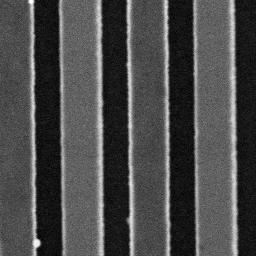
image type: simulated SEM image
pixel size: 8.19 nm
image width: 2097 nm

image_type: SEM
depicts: lines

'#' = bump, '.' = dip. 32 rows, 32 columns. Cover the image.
####....#####...#####...#####...
####....#####...#####...#####...
####....#####...#####...#####...
####....#####...#####...#####...
####....#####...#####...#####...
####....#####...#####...#####...
####....#####...#####...#####...
####....#####...#####...#####...
####....#####...#####...#####...
####....#####...#####...#####...
####....#####...#####...#####...
####....#####...#####...#####...
####....#####...#####...#####...
####....#####...#####...#####...
####....#####...#####...#####...
####....#####...#####...#####...
####....#####...#####...#####...
####....#####...#####...#####...
####....#####...#####...#####...
####....#####...#####...#####...
####....#####...#####...#####...
####....#####...#####...######..
####....#####...#####...######..
####....#####...#####...#####...
####....#####...#####...#####...
####....#####...#####....#####..
####....#####...#####...######..
####....#####...#####....#####..
####....#####...#####....#####..
#####...#####...#####....#####..
#####...#####...#####....#####..
#####...#####...#####....#####..